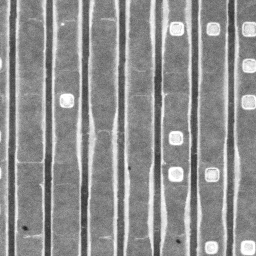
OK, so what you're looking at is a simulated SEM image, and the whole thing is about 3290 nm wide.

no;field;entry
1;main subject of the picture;wiring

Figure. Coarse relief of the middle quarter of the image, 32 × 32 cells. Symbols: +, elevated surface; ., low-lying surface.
++++..+++++++...++++++...++++++.
++++..+++++++...++++++...++++++.
++++..+++++++...++++++...++++++.
++++..+++++++...++++++...++++++.
++++..+++++++...++++++...++++++.
++++..+++++++...++++++...++++++.
++++..+++++++...++++++...++++++.
++++..+++++++...++++++...++++++.
..++..+++++++...++++++...++++++.
..++..+++++++...++++++...++++++.
..++..+++++++...++++++...++++++.
++++..+++++++...++++++...++++++.
++++...++++++...++++++...++++++.
++++...++++++...++++++...++++++.
++++...++++++...++++++..+++++++.
++++...++++++..+++++++..+++++++.
++++...++++++..+++++++..+++++++.
++++...++++++..+++++++..+++..++.
++++...++++++..+++++++..+++...+.
++++...++++++..+++++++..+++..++.
++++...++++++..+++++++..+++++++.
++++...++++++..+++++++..+++++++.
++++...++++++..+++++++..+++++++.
++++...++++++..+++++++..+++++++.
++++...++++++...++++++..+++++++.
++++...++++++...++++++..+++++++.
++++..+++++++...++++++..+++..++.
++++..+++++++...++++++..++....+.
++++..+++++++...++++++..+++..++.
++++..+++++++...++++++...++++++.
++++..+++++++...++++++...++++++.
++++..+++++++...++++++...++++++.